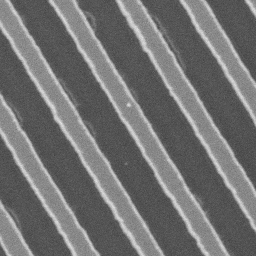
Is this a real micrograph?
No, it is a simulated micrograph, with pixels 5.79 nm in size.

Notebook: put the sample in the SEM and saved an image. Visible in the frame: lines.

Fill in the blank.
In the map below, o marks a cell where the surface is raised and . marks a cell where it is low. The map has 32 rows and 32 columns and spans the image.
o.....oooo.....ooo.....ooo.....o
oo.....ooo.....ooo.....oooo.....
ooo.....ooo.....ooo.....ooo.....
ooo.....ooo.....oooo....oooo....
.ooo.....ooo.....ooo.....ooo....
.ooo.....oooo.....ooo.....ooo...
..ooo.....ooo.....ooo.....oooo..
...ooo.....ooo.....ooo.....ooo..
...ooo.....ooo.....oooo.....ooo.
....ooo.....ooo.....ooo.....ooo.
....ooo.....oooo.....ooo.....ooo
.....ooo.....ooo.....oooo....ooo
o.....ooo.....ooo.....ooo.....oo
o.....ooo.....oooo.....ooo.....o
oo.....ooo.....ooo.....ooo.....o
oo.....ooo......ooo.....ooo.....
ooo.....ooo.....ooo.....ooo.....
oooo.....ooo.....ooo.....ooo....
.ooo.....ooo.....ooo......ooo...
..ooo.....ooo.....ooo.....ooo...
..ooo.....oooo.....ooo.....ooo..
...ooo.....ooo.....ooo.....oooo.
...oooo.....ooo.....ooo.....ooo.
....ooo.....ooo.....ooo......ooo
.....ooo.....ooo.....ooo.....ooo
.....ooo.....oooo.....ooo.....oo
o.....ooo.....ooo.....ooo.....oo
oo.....ooo.....ooo.....ooo.....o
oo.....ooo.....ooo.....oooo.....
ooo.....ooo.....ooo.....ooo.....
ooo.....ooo......ooo.....ooo....
.ooo.....ooo.....ooo.....ooo....